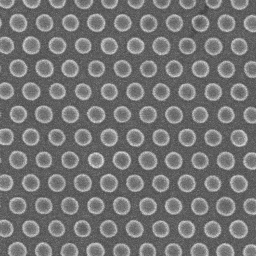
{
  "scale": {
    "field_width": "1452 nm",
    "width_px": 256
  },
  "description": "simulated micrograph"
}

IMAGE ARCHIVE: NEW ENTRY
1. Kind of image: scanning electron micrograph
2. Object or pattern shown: a regular array of raised bodies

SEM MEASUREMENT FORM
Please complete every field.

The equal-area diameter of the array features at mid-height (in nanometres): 93.7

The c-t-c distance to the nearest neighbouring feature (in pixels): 25.9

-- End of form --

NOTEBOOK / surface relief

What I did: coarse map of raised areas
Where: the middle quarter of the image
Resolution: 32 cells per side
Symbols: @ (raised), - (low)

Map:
@@@---@@@@---@@@@--@@@@---@@@---
@@@---@@@@---@@@@--@@@@---@@@@--
@@@----@@@---@@@----@@@---@@@---
--------------------------------
--------------------------------
---@@@----@@@---@@@----@@@---@@@
---@@@@---@@@---@@@@--@@@@---@@@
---@@@@---@@@---@@@@--@@@@---@@@
----@@----@@-----@@----@@@----@@
--------------------------------
--------------------------------
@@@---@@@@---@@@---@@@@---@@@---
@@@---@@@@---@@@---@@@@---@@@@--
@@@---@@@@---@@@---@@@@---@@@@--
--------@-----@-----@@-----@@---
--------------------------------
----@@----@@-----@@----@@-------
---@@@@--@@@@---@@@@---@@@---@@@
---@@@@--@@@@---@@@@--@@@@---@@@
---@@@@---@@@---@@@@--@@@@---@@@
--------------------------------
--------------------------------
@@@----@@----@@@---@@@----@@----
@@@---@@@@--@@@@---@@@@---@@@---
@@@---@@@@--@@@@---@@@@--@@@@---
@@@----@@----@@@---@@@@---@@@---
--------------------------------
--------------------------------
---@@@----@@@---@@@----@@@---@@@
---@@@@--@@@@---@@@@--@@@@---@@@
---@@@@--@@@@---@@@@--@@@@---@@@
----@@----@@@----@@----@@-----@@